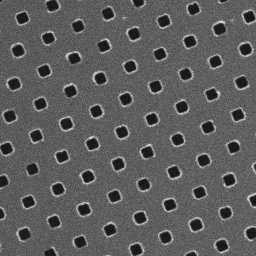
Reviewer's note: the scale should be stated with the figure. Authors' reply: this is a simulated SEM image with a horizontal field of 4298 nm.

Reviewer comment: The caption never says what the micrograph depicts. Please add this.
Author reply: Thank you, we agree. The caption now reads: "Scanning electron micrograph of a regular array of holes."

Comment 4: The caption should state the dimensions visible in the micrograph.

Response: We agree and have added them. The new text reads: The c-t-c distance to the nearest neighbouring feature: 538 nm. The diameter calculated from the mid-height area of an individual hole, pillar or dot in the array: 11.6 px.